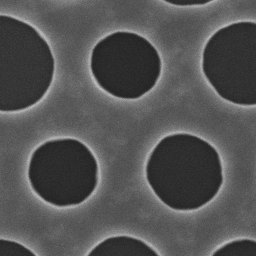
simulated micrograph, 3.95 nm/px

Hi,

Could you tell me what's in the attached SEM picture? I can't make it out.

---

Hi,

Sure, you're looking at holes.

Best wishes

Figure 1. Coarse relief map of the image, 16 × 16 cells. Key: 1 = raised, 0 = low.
1111111111111111
0011111111111110
0001110001111000
0001110000111000
0001110000111000
0001110001111000
0011111111111110
1111111111111111
1111111111101111
1100001110000011
1100001110000011
1100001110000011
1110011111000111
1111111111111111
1111111111111111
0011110001111100